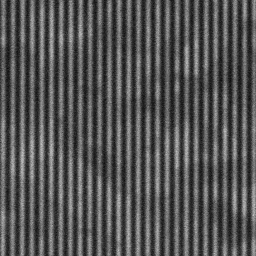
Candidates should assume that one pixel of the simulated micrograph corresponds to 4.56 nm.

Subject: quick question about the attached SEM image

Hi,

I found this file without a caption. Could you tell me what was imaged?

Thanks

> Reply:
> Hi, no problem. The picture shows parallel lines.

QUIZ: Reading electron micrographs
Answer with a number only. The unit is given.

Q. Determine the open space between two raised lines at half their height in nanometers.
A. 34.2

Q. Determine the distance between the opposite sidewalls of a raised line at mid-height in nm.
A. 8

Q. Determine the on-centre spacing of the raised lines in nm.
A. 44